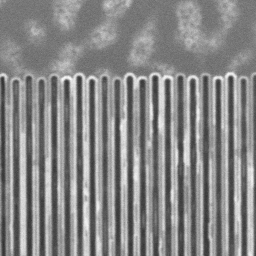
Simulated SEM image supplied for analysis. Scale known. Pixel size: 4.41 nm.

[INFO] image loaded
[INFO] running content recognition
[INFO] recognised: parallel lines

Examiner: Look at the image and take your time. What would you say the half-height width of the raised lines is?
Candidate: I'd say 24.8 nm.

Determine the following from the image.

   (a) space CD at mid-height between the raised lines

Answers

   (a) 28.7 nm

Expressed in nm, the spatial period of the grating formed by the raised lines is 56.